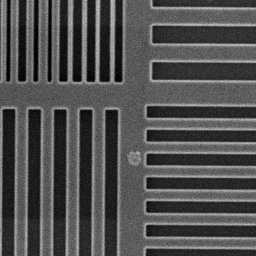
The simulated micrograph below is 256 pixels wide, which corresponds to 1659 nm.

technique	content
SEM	groups of lines, slits or small figures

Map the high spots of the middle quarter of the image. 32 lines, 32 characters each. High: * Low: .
.*...*..*......*******..........
.*...*..*......*******..........
.*...*..*......*******..........
.*...*..*......*******..........
***.**.**..**.******************
********************************
********************************
********************************
********************************
********************************
*********************...........
.***...***....******............
.***...***....******............
.***...***....*******...........
.***...***....******************
.***...***....******************
.***...***....*******...........
.***...***....******............
.***...***....******............
.***...***....*******...........
.***...***....******************
.***...***....******************
.***...***....*******...........
.***...***....******............
.***...***....******............
.***...***....**************....
.***...***....******************
.***...***....******************
.***...***....*******...........
.***...***....******............
.***...***....******............
.***...***....*******...........